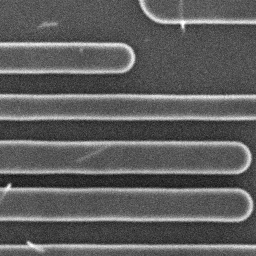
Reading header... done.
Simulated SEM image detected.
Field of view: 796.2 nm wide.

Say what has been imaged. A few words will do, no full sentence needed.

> groups of lines, slits or small figures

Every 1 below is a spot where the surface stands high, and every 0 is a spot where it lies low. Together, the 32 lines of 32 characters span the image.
00000000000000000011111111111111
00000000000000000011111111111111
00000000000000000001111111111111
00000000000000000000000000000000
00000000000000000000000000000000
11111111111111100000000000000000
11111111111111111000000000000000
11111111111111111000000000000000
11111111111111110000000000000000
00000000000000000000000000000000
00000000000000000000000000000000
00000000000000000000000000000000
11111111111111111111111111111111
11111111111111111111111111111111
11111111111111111111111111111111
00000000000000000000000000000000
00000000000000000000000000000000
00000000000000000000000000000000
11111111111111111111111111111110
11111111111111111111111111111110
11111111111111111111111111111110
11111111111111111111111111111100
00000000000000000000000000000000
11000000000000000000000000000000
11111111111111111111111111111110
11111111111111111111111111111110
11111111111111111111111111111110
11111111111111111111111111111100
00000000000000000000000000000000
00000000000000000000000000000000
00000000000000000000000000000000
11111111111111111111111111111111